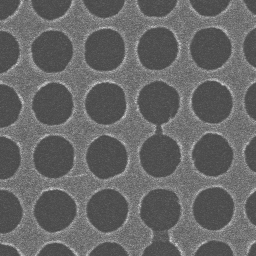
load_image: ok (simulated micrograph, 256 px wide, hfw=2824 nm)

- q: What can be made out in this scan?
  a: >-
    a regular array of holes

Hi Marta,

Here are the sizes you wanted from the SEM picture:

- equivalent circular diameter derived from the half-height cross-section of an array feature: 465 nanometres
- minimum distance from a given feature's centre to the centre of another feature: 583 nm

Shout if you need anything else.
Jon